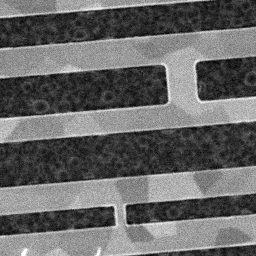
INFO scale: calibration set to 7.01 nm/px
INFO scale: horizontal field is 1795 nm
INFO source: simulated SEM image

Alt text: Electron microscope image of one or a few lines or trenches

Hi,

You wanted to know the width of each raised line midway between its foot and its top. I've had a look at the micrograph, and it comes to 191 nanometres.